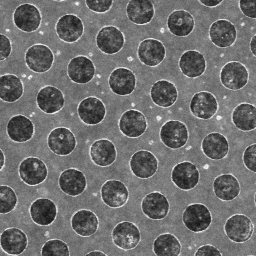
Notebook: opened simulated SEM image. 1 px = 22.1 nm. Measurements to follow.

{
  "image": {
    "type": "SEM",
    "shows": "a regular array of holes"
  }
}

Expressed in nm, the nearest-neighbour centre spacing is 924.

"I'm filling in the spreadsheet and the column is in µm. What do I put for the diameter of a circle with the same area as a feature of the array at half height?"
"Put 0.606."